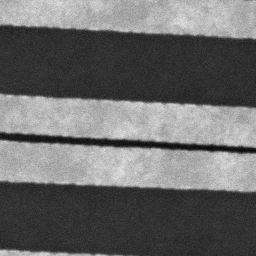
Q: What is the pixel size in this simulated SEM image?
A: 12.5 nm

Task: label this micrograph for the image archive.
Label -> lines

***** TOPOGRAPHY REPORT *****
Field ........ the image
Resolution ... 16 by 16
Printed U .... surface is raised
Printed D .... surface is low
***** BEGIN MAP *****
UUUUUUUUUUUUUUUU
UUUUUUUUUUUUUUUU
DDDDDDDDDDDDDDDD
DDDDDDDDDDDDDDDD
DDDDDDDDDDDDDDDD
DDDDDDDDDDDDDDDD
UUUUUUUUUUDDDDDD
UUUUUUUUUUUUUUUU
DDDDUUUUUUUUUUUU
UUUUUUUUUUUUUUUU
UUUUUUUUUUUUUUUU
DDDDDDUUUUUUUUUU
DDDDDDDDDDDDDDDD
DDDDDDDDDDDDDDDD
DDDDDDDDDDDDDDDD
DDDDDDDDDDDDDDDD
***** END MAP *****